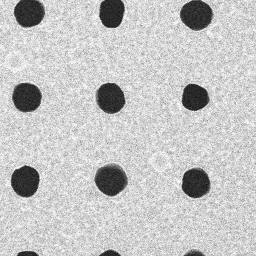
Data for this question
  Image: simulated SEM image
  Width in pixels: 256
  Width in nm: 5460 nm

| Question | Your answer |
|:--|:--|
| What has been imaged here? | holes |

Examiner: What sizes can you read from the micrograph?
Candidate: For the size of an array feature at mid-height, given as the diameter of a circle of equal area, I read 0.623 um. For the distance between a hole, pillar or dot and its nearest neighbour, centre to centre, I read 1780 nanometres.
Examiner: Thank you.